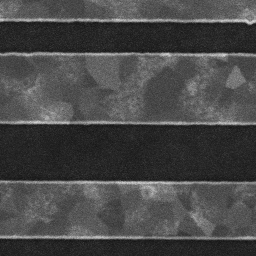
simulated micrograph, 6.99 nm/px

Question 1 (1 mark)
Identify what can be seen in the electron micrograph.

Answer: one or a few lines or trenches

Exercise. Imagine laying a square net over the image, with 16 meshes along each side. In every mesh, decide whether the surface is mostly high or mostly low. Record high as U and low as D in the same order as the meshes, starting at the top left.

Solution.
UUUUUUUUUUUUUUUU
DDDDDDDDDDDDDDDD
DDDDDDDDDDDDDDDD
UUUUUUUUUUUUUUUU
UUUUUUUUUUUUUUUU
UUUUUUUUUUUUUUUU
UUUUUUUUUUUUUUUU
UUUUUUUUUUUUUUUU
DDDDDDDDDDDDDDDD
DDDDDDDDDDDDDDDD
DDDDDDDDDDDDDDDD
UUUUUUUUUUUUUUUU
UUUUUUUUUUUUUUUU
UUUUUUUUUUUUUUUU
UUUUUUUUUUUUUUUU
DDDDDDDDDDDDDDDD